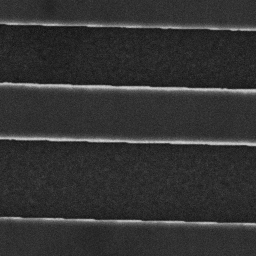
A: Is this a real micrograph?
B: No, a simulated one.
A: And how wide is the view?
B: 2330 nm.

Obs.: lines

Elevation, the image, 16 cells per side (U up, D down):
UUUUUUUUUUUUUUUU
UUUUUUUUUUUUUUUU
DDDDDDDDDDDDDDDD
DDDDDDDDDDDDDDDD
DDDDDDDDDDDDDDDD
UUUUUUUUUUUUDDDD
UUUUUUUUUUUUUUUU
UUUUUUUUUUUUUUUU
UUUUUUUUUUUUUUUU
DDDDDDDDDDDDDDDD
DDDDDDDDDDDDDDDD
DDDDDDDDDDDDDDDD
DDDDDDDDDDDDDDDD
DDDDDDDDDDDDDDDD
UUUUUUUUUUUUUUUU
UUUUUUUUUUUUUUUU